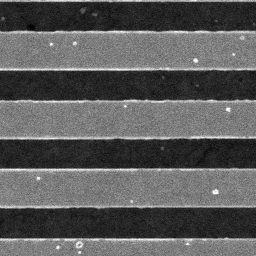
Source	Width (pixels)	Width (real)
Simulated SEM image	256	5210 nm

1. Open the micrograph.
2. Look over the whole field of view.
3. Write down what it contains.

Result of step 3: lines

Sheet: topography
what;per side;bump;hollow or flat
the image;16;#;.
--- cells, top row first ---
................
................
################
################
................
................
################
################
################
................
................
################
################
................
................
################